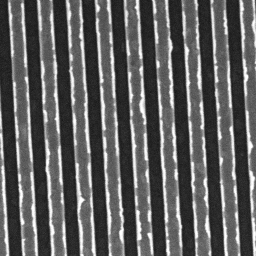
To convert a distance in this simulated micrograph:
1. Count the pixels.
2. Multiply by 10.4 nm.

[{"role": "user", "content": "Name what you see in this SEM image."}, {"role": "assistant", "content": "parallel lines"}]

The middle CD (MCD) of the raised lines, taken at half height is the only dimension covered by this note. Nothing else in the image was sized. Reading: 0.159 micrometres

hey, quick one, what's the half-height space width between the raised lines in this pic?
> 140 nanometres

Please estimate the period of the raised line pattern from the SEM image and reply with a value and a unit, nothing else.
301 nm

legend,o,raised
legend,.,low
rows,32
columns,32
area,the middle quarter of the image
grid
..ooo....ooo....oooo...oooo...oo
.oooo....oooo...oooo...oooo....o
..ooo....oooo...oooo...oooo....o
..ooo....oooo...oooo...oooo....o
..ooo....oooo...oooo....ooo....o
..ooo....oooo...oooo....ooo....o
..oooo...oooo...oooo....ooo....o
..oooo...oooo...oooo....ooo....o
..oooo...oooo....ooo....ooo....o
..oooo...oooo....ooo....ooo....o
..oooo...oooo....ooo....ooo....o
..oooo....ooo....ooo....ooo....o
..oooo....ooo....ooo....ooo....o
..oooo....ooo....ooo....ooo....o
..oooo....ooo....ooo....ooo....o
..oooo....ooo....oooo...oooo...o
...ooo....ooo....oooo...oooo...o
..oooo....ooo....oooo...oooo...o
...ooo....ooo....oooo...oooo...o
...ooo....oooo...oooo...oooo....
...ooo....oooo...oooo...oooo....
...ooo....oooo...oooo...oooo....
...oooo...oooo...oooo...oooo....
...oooo...oooo...oooo...oooo....
...oooo...oooo...oooo...oooo....
...oooo...oooo...oooo...oooo....
...oooo...oooo....ooo....ooo....
...oooo...oooo....ooo....ooo....
...oooo...oooo....ooo....ooo....
...oooo....ooo....ooo....ooo....
...oooo....ooo....ooo....ooo....
...oooo....ooo....ooo....oooo...